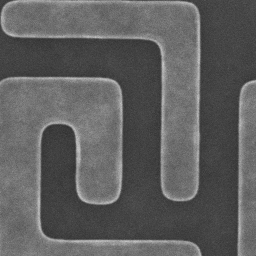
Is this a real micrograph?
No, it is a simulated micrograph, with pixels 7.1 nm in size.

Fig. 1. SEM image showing wiring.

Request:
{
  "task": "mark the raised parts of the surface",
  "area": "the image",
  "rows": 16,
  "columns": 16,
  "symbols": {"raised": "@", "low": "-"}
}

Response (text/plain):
@@@@@@@@@@@@----
@@@@@@@@@@@@----
---------@@@----
----------@@----
----------@@----
@@@@@@@---@@---@
@@@@@@@@--@@---@
@@@@@@@@--@@---@
@@@--@@@--@@---@
@@@--@@@--@@---@
@@@--@@@--@@---@
@@@--@@@--@@---@
@@@--@@----@---@
@@@------------@
@@@------------@
@@@@@@@@@@@@---@